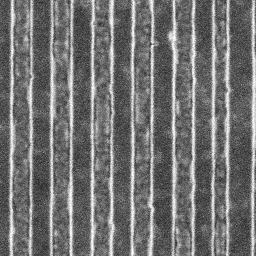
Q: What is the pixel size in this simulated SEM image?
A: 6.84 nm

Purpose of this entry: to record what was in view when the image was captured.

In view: parallel lines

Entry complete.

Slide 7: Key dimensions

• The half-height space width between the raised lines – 18.5 px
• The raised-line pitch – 0.272 µm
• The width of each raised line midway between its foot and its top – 152 nm